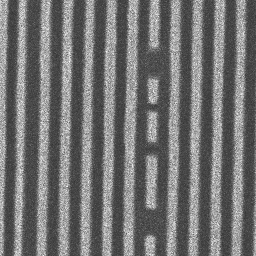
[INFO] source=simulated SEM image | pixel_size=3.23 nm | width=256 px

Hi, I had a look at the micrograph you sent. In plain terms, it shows parallel lines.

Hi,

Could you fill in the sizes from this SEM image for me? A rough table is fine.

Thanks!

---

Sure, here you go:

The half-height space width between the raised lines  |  37.9 nanometres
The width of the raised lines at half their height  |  31.9 nanometers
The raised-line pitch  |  70.6 nanometres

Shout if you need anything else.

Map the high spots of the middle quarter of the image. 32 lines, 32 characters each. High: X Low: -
XX---XX---XXX---XX---------XX---
XX---XX---XXX---XX---------XX---
XX---XX---XXX---XX---------XX---
XX---XX---XXX---XX---------XX---
XX---XX---XXX---XX---XX----XX---
XX---XX---XXX---XX---XX----XX---
XX---XX---XXX---XX---XX----XX---
XX---XX---XXX---XX---XX----XX---
XX---XX---XXX---XX---XX----XX---
XX---XX---XX----XX---XX----XX---
XX---XX---XX----XX--------XXX---
XX---XX---XX----XX--------XXX---
XX---XX---XX---XXX---XX---XXX---
XX---XX---XX---XXX---XX---XXX---
XX---XX---XX---XXX---XX---XXX---
XX---XX---XX---XXX---XX---XXX---
XX---XX---XX---XXX---XX---XXX---
XX---XX---XX---XXX---XX---XXX---
X----XX---XX---XXX---XX---XXX---
X----XX---XX---XXX--------XXX---
X----XX---XX---XXX--------XXX---
X----XX---XX---XXX--------XXX---
X----XX---XX---XXX--------XXX---
X----XX---XX---XXX---XX---XXX---
X----XX---XX---XXX---XX---XXX---
X---XXX---XX---XXX---XX---XXX---
X---XXX---XX---XXX---XX---XXX---
X---XXX---XX---XXX---XX---XXX---
X---XXX---XX---XXX--XXX---XXX---
X---XXX---XX---XXX--XXX---XX----
X---XXX---XX---XXX---XX---XX----
X---XXX---XX---XX----XX---XX----